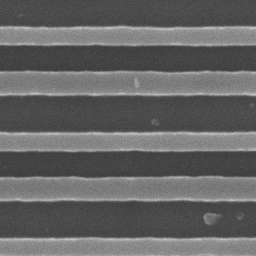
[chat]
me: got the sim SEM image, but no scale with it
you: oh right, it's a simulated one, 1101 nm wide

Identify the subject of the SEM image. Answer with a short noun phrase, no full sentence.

lines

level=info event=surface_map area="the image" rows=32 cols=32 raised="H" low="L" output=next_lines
LLLLLLLLLLLLLLLLLLLLLLLLLLLLLLLL
LLLLLLLLLLLLLLLLLLLLLLLLLLLLLLLL
LLLLLLLLLLLLLLLLLLLLLLLLLLLLLLLL
HHHHLLLLLHHHHHHHHLHLLLLLLHHHHHHH
HHHHHHHHHHHHHHHHHHHHHHHHHHHHHHHH
HHHHHHHHHHHHHHHHHHHHHHHHHHHHHHHH
LLLLLLLLLLLLLLLLLLLLLLLLLLLLLLLL
LLLLLLLLLLLLLLLLLLLLLLLLLLLLLLLL
LLLLLLLLLLLLLLLLLLLLLLLLLLLLLLLL
HHHHHHHHHHHHHHHHHHHHHHHHHHHHHHHH
HHHHHHHHHHHHHHHHHHHHHHHHHHHHHHHH
HHHHHHHHHHHHHHHHHHHHHHHHHHHHHHHH
LLLLLLLLLLLLLLLLLLLLLLLLLLLLLLLL
LLLLLLLLLLLLLLLLLLLLLLLLLLLLLLLL
LLLLLLLLLLLLLLLLLLLLLLLLLLLLLLLL
LLLLLLLLLLLLLLLLLLLLLLLLLLLLLLLL
LLLLLLLLLLLLLLLLLLLLLLLLLLLLLLLL
HHHHHHHHHHHHHHHHHHHHHHHHHHHHHHHH
HHHHHHHHHHHHHHHHHHHHHHHHHHHHHHHH
LLLLLLLLLLLLLLLLLLLLLLLLLLLLLLLL
LLLLLLLLLLLLLLLLLLLLLLLLLLLLLLLL
LLLLLLLLLLLLLLLLLLLLLLLLLLLLLLLL
HHHHHHHHHHHHHHHHHHHHHHHHHHHHHHHH
HHHHHHHHHHHHHHHHHHHHHHHHHHHHHHHH
HHHHHHHHHHHHHHHHHHHHHHHHHHHHHHHH
LLLLLLLLLLLLLLLLLLLLLLLLLLLLLLLL
LLLLLLLLLLLLLLLLLLLLLLLLLLLLLLLL
LLLLLLLLLLLLLLLLLLLLLLLLLLLLLLLL
LLLLLLLLLLLLLLLLLLLLLLLLLLLLLLLL
LLLLLLLLLLLLLLLLLLLLLLLLLLLLLLLL
HHHHHHHHHHHHHHHHHHHHHHHHHHHHHHHH
HHHHHHHHHHHHHHHHHHHHHHHHHHHHHHHH